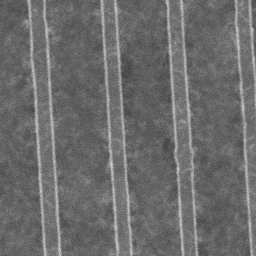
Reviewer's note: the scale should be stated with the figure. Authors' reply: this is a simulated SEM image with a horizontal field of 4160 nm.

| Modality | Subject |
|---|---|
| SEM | one or a few lines or trenches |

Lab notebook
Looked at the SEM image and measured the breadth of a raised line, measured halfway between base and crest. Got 223 nanometers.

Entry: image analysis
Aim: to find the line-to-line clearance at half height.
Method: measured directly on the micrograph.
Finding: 0.892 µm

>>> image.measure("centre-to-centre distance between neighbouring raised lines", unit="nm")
1110